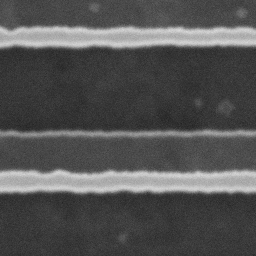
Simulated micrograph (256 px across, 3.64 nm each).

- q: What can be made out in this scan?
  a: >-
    lines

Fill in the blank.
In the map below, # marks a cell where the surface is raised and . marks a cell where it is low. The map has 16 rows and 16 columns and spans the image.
################
################
################
................
................
................
................
................
################
################
################
################
................
................
................
................